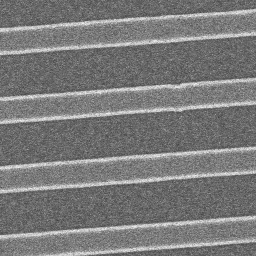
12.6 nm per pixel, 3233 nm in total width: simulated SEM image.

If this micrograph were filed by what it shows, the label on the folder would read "one or a few lines or trenches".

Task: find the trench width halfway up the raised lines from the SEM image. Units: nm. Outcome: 564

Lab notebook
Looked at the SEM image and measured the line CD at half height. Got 309 nm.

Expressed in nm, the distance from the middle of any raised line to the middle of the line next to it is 868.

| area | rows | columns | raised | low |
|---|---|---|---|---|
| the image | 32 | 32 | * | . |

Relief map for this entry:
................................
.............................***
...............*****************
..******************************
*****************************...
****************................
***.............................
................................
................................
................................
........................********
...........*********************
********************************
************************........
************....................
................................
................................
................................
................................
..................**************
......**************************
********************************
*******************.............
******..........................
................................
................................
................................
............................****
...............*****************
..******************************
**************************......
*************...................